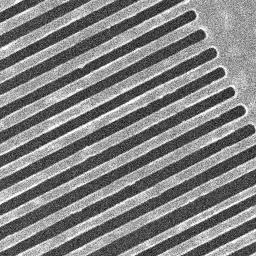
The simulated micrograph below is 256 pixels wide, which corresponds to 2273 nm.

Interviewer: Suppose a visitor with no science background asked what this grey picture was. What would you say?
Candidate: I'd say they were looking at parallel lines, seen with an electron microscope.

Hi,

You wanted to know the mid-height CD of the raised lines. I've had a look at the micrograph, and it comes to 87.8 nm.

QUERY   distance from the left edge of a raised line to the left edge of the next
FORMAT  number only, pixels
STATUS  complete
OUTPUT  21.4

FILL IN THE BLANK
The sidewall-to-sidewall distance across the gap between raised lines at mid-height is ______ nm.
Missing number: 104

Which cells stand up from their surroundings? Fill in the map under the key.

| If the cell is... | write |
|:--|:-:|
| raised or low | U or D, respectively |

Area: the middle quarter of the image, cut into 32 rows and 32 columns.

UUUUUDDDDDUUUUUUDDDDDDUUUUUDDDDD
UUDDDDDDUUUUUUDDDDDDUUUUUUDDDDDD
DDDDDDUUUUUUDDDDDDUUUUUUDDDDDDUU
DDDDDUUUUUDDDDDDUUUUUUDDDDDDUUUU
DDDUUUUUDDDDDDUUUUUUDDDDDDUUUUUU
DUUUUUDDDDDDUUUUUUDDDDDDUUUUUUDD
UUUUDDDDDDUUUUUUDDDDDDUUUUUUDDDD
UUDDDDDDUUUUUUDDDDDDUUUUUUDDDDDD
UDDDDDUUUUUUDDDDDDUUUUUUDDDDDDUU
DDDDUUUUUUDDDDDDUUUUUUDDDDDDUUUU
DDDUUUUUUDDDDDUUUUUUDDDDDDUUUUUD
DUUUUUDDDDDDUUUUUUDDDDDDUUUUUDDD
UUUUUDDDDDUUUUUUDDDDDDUUUUUDDDDD
UUDDDDDDDUUUUUDDDDDDUUUUUDDDDDDD
DDDDDDUUUUUUDDDDDDUUUUUUDDDDDDUU
DDDDUUUUUUDDDDDDUUUUUUDDDDDDUUUU
DDDUUUUUDDDDDDUUUUUUDDDDDDUUUUUD
DUUUUUDDDDDDUUUUUUDDDDDDUUUUUUDD
UUUUDDDDDDUUUUUUDDDDDDUUUUUUDDDD
UUDDDDDDDUUUUUDDDDDDUUUUUUDDDDDD
DDDDDDDUUUUUDDDDDDUUUUUUDDDDDDUU
DDDDDUUUUUDDDDDDDUUUUUDDDDDDUUUU
DDDUUUUUDDDDDDDUUUUUDDDDDDUUUUUD
DUUUUUDDDDDDDUUUUUDDDDDDUUUUUDDD
UUUUDDDDDDDUUUUUDDDDDDUUUUUDDDDD
UUDDDDDDDUUUUUDDDDDDUUUUUDDDDDDD
DDDDDDDUUUUUDDDDDDUUUUUDDDDDDDUU
DDDDDUUUUUDDDDDDUUUUUDDDDDDDUUUU
DDDUUUUUDDDDDDUUUUUDDDDDDDUUUUUD
DUUUUUDDDDDDDUUUUUDDDDDDUUUUUDDD
UUUUDDDDDDDUUUUUDDDDDDDUUUUDDDDD
UUDDDDDDDUUUUUDDDDDDDUUUUUDDDDDD